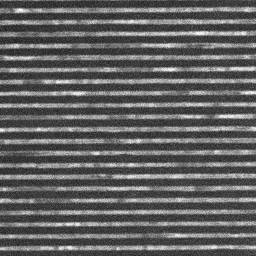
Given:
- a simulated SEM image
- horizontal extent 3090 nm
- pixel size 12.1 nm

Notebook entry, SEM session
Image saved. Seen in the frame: parallel lines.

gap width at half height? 104 nm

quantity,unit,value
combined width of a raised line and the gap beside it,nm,143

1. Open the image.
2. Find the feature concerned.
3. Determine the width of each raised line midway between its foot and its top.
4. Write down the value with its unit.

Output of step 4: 37.7 nanometers